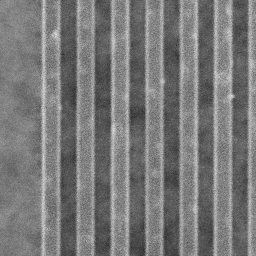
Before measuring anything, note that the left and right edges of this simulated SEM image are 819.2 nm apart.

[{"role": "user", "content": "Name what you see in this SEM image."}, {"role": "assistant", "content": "parallel lines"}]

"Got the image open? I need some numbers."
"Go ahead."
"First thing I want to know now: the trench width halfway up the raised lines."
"17.8 pixels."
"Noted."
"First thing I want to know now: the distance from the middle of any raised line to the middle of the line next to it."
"0.11 um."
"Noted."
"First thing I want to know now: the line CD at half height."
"17 px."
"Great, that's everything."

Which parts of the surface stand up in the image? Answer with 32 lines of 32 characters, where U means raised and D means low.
DDDDDUUDDDUUDDUUDDUUDDDUUDDUUDDU
DDDDDUUDDDUUDDUUDDUUDDDUUDDUUDDU
DDDDDUUDDDUUDDUUDDUUDDDUUDDUUDDU
DDDDDUUDDDUUDDUUDDUUDDDUUDDUUDDU
DDDDDUUDDDUUDDUUDDUUDDDUUDDUUDDU
DDDDDUUDDDUUDDUUDDUUDDDUUDDUUDDU
DDDDDUUDDDUUDDUUDDUUDDDUUDDUUDDU
DDDDDUUDDDUUDDUUDDUUDDDUUDDUUDDU
DDDDDUUDDDUUDDUUDDUUDDDUUDDUUDDU
DDDDDDUDDDUUDDUUDDUUDDDUUDDUUDDU
DDDDDUUDDDUUDDUUDDUUDDDUUDDUUDDU
DDDDDUUDDDUUDDUUDDUUDDDUUDDUUDDU
DDDDDUUDDDUUDDUUDDUUDDDUUDDUUDDU
DDDDDUUDDDUUDDUUDDUUDDDUUDDUUDDU
DDDDDUUDDDUUDDUUDDUUDDDUUDDUUDDU
DDDDDUUDDDUUDDUUDDUUDDDUUDDUUDDU
DDDDDUUDDDUUDDUUDDUUDDDUUDDUUDDU
DDDDDUUDDDUUDDUUDDUUDDDUUDDUUDDU
DDDDDUUDDDUUDDUUDDUUDDDUUDDUUDDU
DDDDDUUDDDUUDDUUDDUUDDDUUDDUUDDU
DDDDDUUDDDUUDDUUDDUUDDDUUDDUUDDU
DDDDDUUDDDUUDDUUDDUUDDDUUDDUUDDU
DDDDDUUDDDUUDDUUDDUUDDDUUDDUUDDU
DDDDDUUDDDUUDDUUDDUUDDDUUDDUUDDU
DDDDDUUDDDUUDDUUDDUUDDDUUDDUUDDU
DDDDDUUDDDUUDDUUDDUUDDDUUDDUUDDU
DDDDDUUDDDUUDDUUDDUUDDDUUDDUUDDU
DDDDDUUDDDUUDDUUDDUUDDDUUDDUUDDU
DDDDDUUDDDUUDDUUDDUUDDDUUDDUUDDU
DDDDDUUDDDUUDDUUDDUUDDDUUDDUUDDU
DDDDDUUDDDUUDDUUDDUUDDDUUDDUUDDU
DDDDDUUDDDUUDDUUDDUUDDDUUDDUUDDU